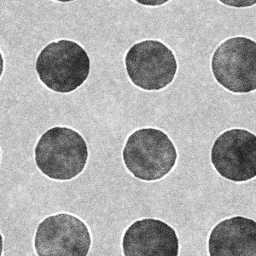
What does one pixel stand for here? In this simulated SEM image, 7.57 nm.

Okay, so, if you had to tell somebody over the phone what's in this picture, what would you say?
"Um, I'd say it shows holes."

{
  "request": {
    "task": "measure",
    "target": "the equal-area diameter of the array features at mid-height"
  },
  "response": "404 nanometers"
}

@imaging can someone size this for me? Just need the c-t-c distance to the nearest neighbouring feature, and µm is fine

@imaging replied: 0.663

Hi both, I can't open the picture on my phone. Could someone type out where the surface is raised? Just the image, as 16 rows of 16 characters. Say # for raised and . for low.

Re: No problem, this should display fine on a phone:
################
################
##############..
##...###...##...
##....##...##...
###..####.####..
################
################
###..###..####..
##...###...##...
##...###...##...
################
################
###..###########
##....##...##...
##....##...##...